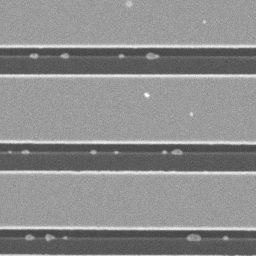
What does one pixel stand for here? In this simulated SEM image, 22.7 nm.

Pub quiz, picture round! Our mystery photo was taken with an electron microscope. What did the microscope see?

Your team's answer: lines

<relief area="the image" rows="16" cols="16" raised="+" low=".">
++++++++++++++++
++++++++++++++++
++++++++++++++++
................
................
++++++++++++++++
++++++++++++++++
++++++++++++++++
++++++++++++++++
................
................
++++++++++++++++
++++++++++++++++
++++++++++++++++
................
................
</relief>